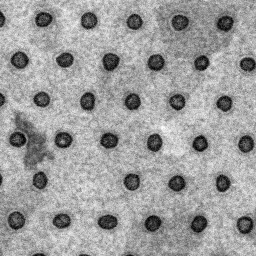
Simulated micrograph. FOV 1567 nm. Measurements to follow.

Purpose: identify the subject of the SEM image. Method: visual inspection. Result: a regular array of holes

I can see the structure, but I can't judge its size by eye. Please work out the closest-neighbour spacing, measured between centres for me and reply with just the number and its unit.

278 nanometers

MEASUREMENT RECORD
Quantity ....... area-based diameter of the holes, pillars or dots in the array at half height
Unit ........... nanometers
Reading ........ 107